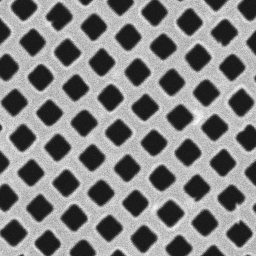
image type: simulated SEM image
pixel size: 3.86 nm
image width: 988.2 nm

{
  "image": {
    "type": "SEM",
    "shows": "a regular array of holes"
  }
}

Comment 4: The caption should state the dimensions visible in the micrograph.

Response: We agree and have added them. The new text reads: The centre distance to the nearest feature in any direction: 35.8 pixels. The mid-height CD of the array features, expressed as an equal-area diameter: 90.2 nm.